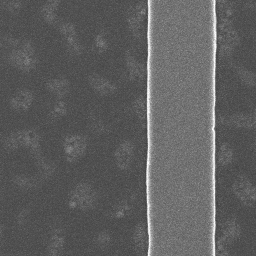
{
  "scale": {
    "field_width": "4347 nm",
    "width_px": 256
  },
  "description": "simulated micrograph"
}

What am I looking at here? one or a few lines or trenches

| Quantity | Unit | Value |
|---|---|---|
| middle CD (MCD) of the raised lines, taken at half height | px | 66.5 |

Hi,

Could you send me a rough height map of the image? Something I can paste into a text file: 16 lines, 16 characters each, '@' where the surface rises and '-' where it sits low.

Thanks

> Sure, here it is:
---------@@@@---
---------@@@@---
---------@@@@---
---------@@@@---
---------@@@@---
---------@@@@---
---------@@@@---
---------@@@@---
---------@@@@---
---------@@@@---
---------@@@@---
---------@@@@---
---------@@@@---
---------@@@@---
---------@@@@---
---------@@@@---